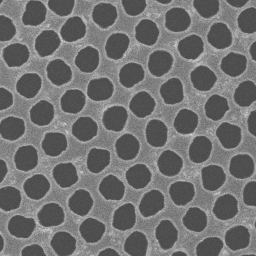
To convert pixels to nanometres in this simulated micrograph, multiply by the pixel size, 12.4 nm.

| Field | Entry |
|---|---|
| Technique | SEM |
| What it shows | a regular array of holes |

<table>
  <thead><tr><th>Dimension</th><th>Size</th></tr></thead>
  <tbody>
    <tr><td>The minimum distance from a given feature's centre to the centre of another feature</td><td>385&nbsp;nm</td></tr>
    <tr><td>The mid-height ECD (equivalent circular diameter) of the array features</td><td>314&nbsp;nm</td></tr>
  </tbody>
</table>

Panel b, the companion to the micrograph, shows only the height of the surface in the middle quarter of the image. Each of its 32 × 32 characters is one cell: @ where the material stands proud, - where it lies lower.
-@@-----@@@@@@@----@@------@@@@@
--@@----@@@@@@------@-----@@@@@@
--@@@@@@@@@@@@------@@---@@@@@@@
--@@@@@@@-@@@@------@@@@@@@-@@@@
-@@@@@------@@-----@@@@@@@---@@@
@@@@@@------@@@--@@@@@@@------@@
@---@@------@@@@@@@@@@@@------@@
-----@------@@@@@@---@@@------@@
-----@@----@@@@@@-----@@@-----@@
-----@@@@@@@@@@@-------@@----@@@
-----@@@@@@@@-@@-------@@@@@@@@@
----@@@@@@@-----@-----@@@@@@@---
@@-@@@@@@@------@-----@@@@@@----
@@@@---@@@------@@@@@@@@@@@@----
@@@-----@@------@@@@@----@@-----
@@------@@-----@@@@@@-----@-----
@@------@@@----@@@@@------@@----
@@------@@@@@@@--@@@------@@@@-@
-@@----@@@@@@@----@@@-----@@@@@@
-@@@@@@@@@@@@------@@-----@@@@@@
-@@@@@@@@@@@@------@@@---@@@@@@-
@@@@@@@----@@------@@@@@@@-@@@@-
@@@@@@------@-----@@@@@@----@@@-
@@@@@@------@@----@@@@@@-----@@-
@@@@@@-----@@@@@@@@@@@@-------@@
---@@@-----@@@@@@----@@-------@@
---@@@----@@@@@@-----@@@-----@@@
---@@@@@@@@@@@@-------@@@---@@@@
----@@@@@@---@@-------@@@@@@@@@@
---@@@@@@-----@@-----@@@@@@@---@
--@@@@@@@------@@----@@@@@@-----
@@@--@@@@------@@@@@@@-@@@------